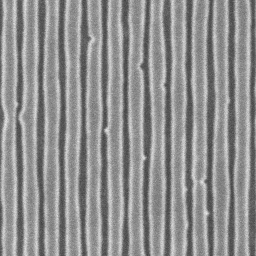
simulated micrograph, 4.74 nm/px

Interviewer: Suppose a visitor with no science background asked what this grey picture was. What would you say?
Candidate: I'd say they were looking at parallel lines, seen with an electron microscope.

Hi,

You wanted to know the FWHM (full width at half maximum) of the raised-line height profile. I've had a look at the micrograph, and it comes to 59.8 nm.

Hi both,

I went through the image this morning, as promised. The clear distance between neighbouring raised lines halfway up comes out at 40.9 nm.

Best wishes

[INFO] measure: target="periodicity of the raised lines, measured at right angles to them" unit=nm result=100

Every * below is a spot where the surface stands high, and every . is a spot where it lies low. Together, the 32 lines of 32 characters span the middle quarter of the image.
.***..***..***..***...***..***..
.***..***..***..***...***..***..
.***..***..****.****..***..***..
.***..***..****.****..***..***..
.***..***..****.****..***..***..
.***..***..***..****..***..***..
.***..***..***..****..***..***..
.***..***..***..****..***..***..
.***..***..****.****..***..***..
.***..***..****.****..***..***..
.***..***..****.****..***..***..
.***..***..***..****..***..***..
.***..***..***..****..***..***..
.***..***..***..***...***..***..
.***..***..****.***...***..***..
.***..***..****.***...***..***..
.***..***.****..****..***..***..
.***..***..***..****..***..***..
.***..***..***...***..***..***..
.***..***..***...***..***..***..
.***..***..***...***..***..***..
.***..***..***...***..***..***..
.**...***..***...***..***..***..
.**...***..***...***..***..***..
.**...***..***...***..***..***..
.**...***..***...***..***..***..
.**...***..***...***..***..***..
.**...***..***...**...***..***..
.**...***..***...***..***..***..
.**...***..***...**...***..***..
.**...***..***...**...***..***..
.**...***..****..**..****..***..